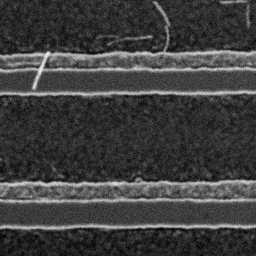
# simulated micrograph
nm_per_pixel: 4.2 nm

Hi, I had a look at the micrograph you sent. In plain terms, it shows lines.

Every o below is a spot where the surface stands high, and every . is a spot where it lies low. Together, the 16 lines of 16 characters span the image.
................
................
................
oooooooooooooooo
oooooooooooooooo
oooooooooooooooo
................
................
................
................
................
oooooooooooooooo
oooooooooooooooo
oooooooooooooooo
................
................